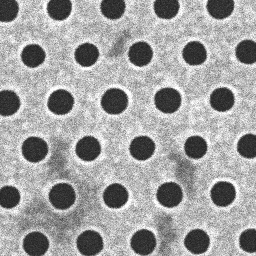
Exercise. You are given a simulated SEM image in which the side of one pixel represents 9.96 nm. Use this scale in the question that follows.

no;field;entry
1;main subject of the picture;a regular array of holes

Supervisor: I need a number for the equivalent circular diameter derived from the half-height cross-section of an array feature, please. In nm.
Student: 257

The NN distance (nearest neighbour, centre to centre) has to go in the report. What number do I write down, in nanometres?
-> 534